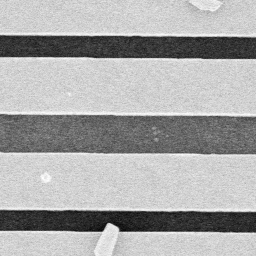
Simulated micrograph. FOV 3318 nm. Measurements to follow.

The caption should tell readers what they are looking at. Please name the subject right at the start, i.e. lines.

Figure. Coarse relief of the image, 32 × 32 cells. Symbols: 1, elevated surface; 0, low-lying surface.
11111111111111111111111111111111
11111111111111111111111111111111
11111111111111111111111111111111
11111111111111111111111111111111
00000000000000001111111111111111
00000000000000000000000000000000
00000000000000000000000000000000
11111111111111111111111111111111
11111111111111111111111111111111
11111111111111111111111111111111
11111111111111111111111111111111
11111111111111111111111111111111
11111111111111111111111111111111
11111111111111111111111111111111
00000000000000000000000000000000
00000000000000000000000000000000
00000000000000000000000000000000
00000000000000000000000000000000
00000000000000000000000000000000
11111111111111111111111111111111
11111111111111111111111111111111
11111111111111111111111111111111
11111111111111111111111111111111
11111111111111111111111111111111
11111111111111111111111111111111
11111111111111111111111111111111
00000000000000000000000000000000
00000000000000000000000000000000
00000000000001100000000000000000
11111111111111111111111111111111
11111111111111111111111111111111
11111111111111111111111111111111